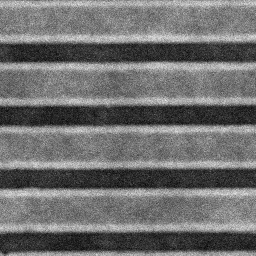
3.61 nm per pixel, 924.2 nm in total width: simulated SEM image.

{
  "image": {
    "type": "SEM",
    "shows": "one or a few lines or trenches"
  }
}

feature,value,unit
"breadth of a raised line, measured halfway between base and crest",129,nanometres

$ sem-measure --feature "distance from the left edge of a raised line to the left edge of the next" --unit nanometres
228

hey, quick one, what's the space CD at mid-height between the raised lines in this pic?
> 27.5 px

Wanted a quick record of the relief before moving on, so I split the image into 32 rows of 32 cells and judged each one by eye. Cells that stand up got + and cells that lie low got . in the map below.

++++++++++++++++++++++++++++++++
++++++++++++++++++++++++++++++++
++++++++++++++++++++++++++++++++
++++++++++++++++++++++++++++++++
++++++++++++++++++++++++++++++++
................................
................................
................................
++++++++++++++++++++++++++++++++
++++++++++++++++++++++++++++++++
++++++++++++++++++++++++++++++++
++++++++++++++++++++++++++++++++
++++++++++++++++++++++++++++++++
................................
................................
................................
++++++++++++++++++++++++++++++++
++++++++++++++++++++++++++++++++
++++++++++++++++++++++++++++++++
++++++++++++++++++++++++++++++++
++++++++++++++++++++++++++++++++
................................
................................
................................
++++++++++++++++++++++++++++++++
++++++++++++++++++++++++++++++++
++++++++++++++++++++++++++++++++
++++++++++++++++++++++++++++++++
+++++++++++++++.................
................................
................................
................................